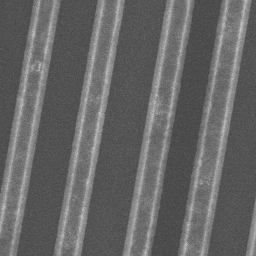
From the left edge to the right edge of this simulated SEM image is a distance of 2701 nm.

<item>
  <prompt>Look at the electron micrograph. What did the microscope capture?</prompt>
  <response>one or a few lines or trenches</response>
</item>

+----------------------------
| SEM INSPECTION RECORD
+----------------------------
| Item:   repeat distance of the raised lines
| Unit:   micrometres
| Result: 0.656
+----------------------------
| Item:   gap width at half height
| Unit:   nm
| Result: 458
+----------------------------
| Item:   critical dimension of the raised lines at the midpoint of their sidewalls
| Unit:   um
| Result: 0.218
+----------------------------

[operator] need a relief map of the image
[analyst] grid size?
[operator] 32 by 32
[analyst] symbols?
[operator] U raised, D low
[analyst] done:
DDDDDUUDDDDDDUUDDDDDDUUUDDDDUUUD
DDDDUUUDDDDDUUUDDDDDDUUUDDDDUUUD
DDDDUUUDDDDDUUUDDDDDDUUUDDDDUUUD
DDDDUUUDDDDDUUUDDDDDDUUDDDDDUUDD
DDDDUUDDDDDDUUDDDDDDDUUDDDDUUUDD
DDDDUUDDDDDDUUDDDDDDUUUDDDDUUUDD
DDDDUUDDDDDDUUDDDDDDUUUDDDDUUUDD
DDDUUUDDDDDUUUDDDDDDUUUDDDDUUUDD
DDDUUUDDDDDUUUDDDDDDUUUDDDDUUUDD
DDDUUUDDDDDUUUDDDDDDUUDDDDDUUDDD
DDDUUDDDDDDUUDDDDDDUUUDDDDUUUDDD
DDDUUDDDDDDUUDDDDDDUUUDDDDUUUDDD
DDUUUDDDDDDUUDDDDDDUUUDDDDUUUDDD
DDUUUDDDDDUUUDDDDDDUUUDDDDUUUDDD
DDUUUDDDDDUUUDDDDDDUUDDDDDUUUDDD
DDUUDDDDDDUUUDDDDDDUUDDDDUUUDDDD
DDUUDDDDDDUUDDDDDDUUUDDDDUUUDDDD
DDUUDDDDDDUUDDDDDDUUUDDDDUUUDDDD
DUUUDDDDDUUUDDDDDDUUUDDDDUUUDDDD
DUUUDDDDDUUUDDDDDDUUUDDDDUUUDDDD
DUUUDDDDDUUUDDDDDDUUDDDDDUUDDDDD
DUUDDDDDDUUDDDDDDDUUDDDDUUUDDDDD
DUUDDDDDDUUDDDDDDUUUDDDDUUUDDDDD
DUUDDDDDDUUDDDDDDUUUDDDDUUUDDDDD
UUUDDDDDUUUDDDDDDUUUDDDDUUUDDDDD
UUUDDDDDUUUDDDDDDUUUDDDDUUUDDDDD
UUUDDDDDUUUDDDDDDUUDDDDDUUDDDDDD
UUDDDDDDUUUDDDDDDUUDDDDUUUDDDDDD
UUDDDDDDUUDDDDDDUUUDDDDUUUDDDDDD
UUDDDDDDUUDDDDDDUUUDDDDUUUDDDDDD
UUDDDDDUUUDDDDDDUUUDDDDUUUDDDDDU
UUDDDDDUUUDDDDDDUUUDDDDUUUDDDDDU